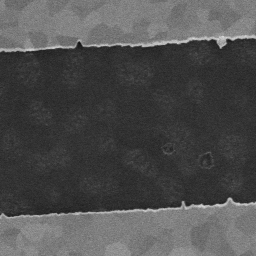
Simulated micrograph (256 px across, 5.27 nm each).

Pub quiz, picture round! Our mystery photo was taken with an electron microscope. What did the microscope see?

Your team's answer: one or a few lines or trenches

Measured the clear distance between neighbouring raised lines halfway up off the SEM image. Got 873 nanometers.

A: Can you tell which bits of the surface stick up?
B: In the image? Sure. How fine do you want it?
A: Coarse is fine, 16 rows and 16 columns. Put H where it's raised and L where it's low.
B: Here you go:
HHHHHHHHHHHHHHHH
HHHHHHHHHHHHHHHH
HHHHHHHHHHHHLHLL
LLLLLLLLLLLLLLLL
LLLLLLLLLLLLLLLL
LLLLLLLLLLLLLLLL
LLLLLLLLLLLLLLLL
LLLLLLLLLLLLLLLL
LLLLLLLLLLLLLLLL
LLLLLLLLLLLLLLLL
LLLLLLLLLLLLLLLL
LLLLLLLLLLLLLLLL
LLLLLLLLLLLLLLLL
LHHHHHHHHHHHHHHH
HHHHHHHHHHHHHHHH
HHHHHHHHHHHHHHHH